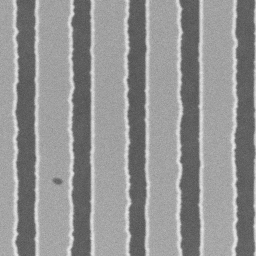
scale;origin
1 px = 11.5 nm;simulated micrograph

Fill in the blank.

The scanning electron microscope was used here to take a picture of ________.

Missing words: lines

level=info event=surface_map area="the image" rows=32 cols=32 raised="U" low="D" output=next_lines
UUDDDUUUUDDUUUUUDDUUUUDDDUUUUUDD
UUDDDUUUUDDUUUUUDDUUUUUDDUUUUUDD
UUDDDUUUUDDUUUUUDDUUUUUDDUUUUDDD
UUDDDUUUUDDUUUUUDDUUUUUDDUUUUDDD
UUDDDUUUUDDUUUUUDDUUUUUDDUUUUDDD
UUDDDUUUUDDUUUUUDDUUUUDDDUUUUUDD
UUDDDUUUUDDUUUUUDDUUUUUDDUUUUDDD
UUDDDUUUUDDUUUUUDDUUUUUDDUUUUUDD
UUDDDUUUUDDUUUUUDDUUUUDDDUUUUDDD
UUDDDUUUUDDUUUUUDDUUUUUDDUUUUDDD
UUDDUUUUUDDUUUUUDDUUUUUDDUUUUDDD
UUDDDUUUUDDUUUUUDDUUUUDDDUUUUDDD
UUDDUUUUUDDUUUUUDDUUUUUDDUUUUUDD
UUDDDUUUUDDUUUUUDDUUUUUDDUUUUUDD
UUDDDUUUUDDUUUUUDDUUUUUDDUUUUDDD
UUDDUUUUUDDUUUUUDDUUUUDDDUUUUUDD
UUDDDUUUUDDUUUUUDDUUUUDDDUUUUDDD
UUDDDUUUUDDUUUUUDDUUUUDDDUUUUDDD
UUDDDUUUUDDUUUUUDDUUUUDDDUUUUDDD
UUDDDUUUUDDUUUUUDDUUUUUDDUUUUDDD
UUDDDUUUUDDUUUUUDDUUUUUDDUUUUDDD
UUDDDUUUUDDUUUUUDDUUUUUDDUUUUDDD
UUDDDUUUUDDUUUUUDDUUUUUDDUUUUDDD
UUDDDUUUUDDUUUUUDDUUUUDDDUUUUDDD
UUDDDUUUUDDUUUUUDDUUUUDDDUUUUUDD
UUDDDUUUUDDUUUUUDDUUUUDDDUUUUDDD
UUDDUUUUUDDUUUUUDDUUUUDDDUUUUUDD
UUDDUUUUUDDUUUUUDDUUUUDDDUUUUUDD
UUDDDUUUUDDUUUUUDDUUUUDDDUUUUDDD
UUDDDUUUUDDUUUUUDDUUUUUDDUUUUUDD
UUDDDUUUUDDUUUUUDDUUUUUDDUUUUUDD
UUDDDUUUUDDUUUUUDDUUUUUDDUUUUDDD